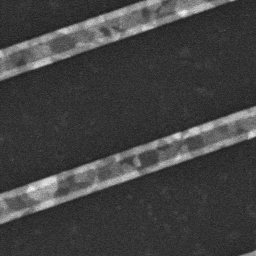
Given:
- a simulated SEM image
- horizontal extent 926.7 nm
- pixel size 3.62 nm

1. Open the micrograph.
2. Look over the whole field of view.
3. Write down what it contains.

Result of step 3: one or a few lines or trenches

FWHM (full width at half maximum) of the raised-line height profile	22.8	pixels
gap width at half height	0.409	microns